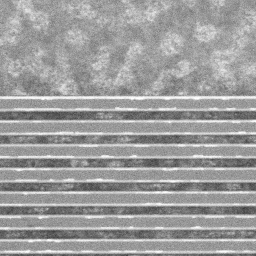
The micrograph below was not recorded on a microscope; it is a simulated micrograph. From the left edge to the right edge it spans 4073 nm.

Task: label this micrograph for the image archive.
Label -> parallel lines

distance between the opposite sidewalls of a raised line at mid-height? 215 nm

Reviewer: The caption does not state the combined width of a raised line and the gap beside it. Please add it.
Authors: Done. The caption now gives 23.7 pixels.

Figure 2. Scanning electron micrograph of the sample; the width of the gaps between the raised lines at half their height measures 157 nm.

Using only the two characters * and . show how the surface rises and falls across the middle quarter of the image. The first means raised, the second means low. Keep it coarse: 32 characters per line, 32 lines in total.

................................
................................
................................
................................
................................
................................
................................
................................
********************************
********************************
********************************
................................
................................
................................
********************************
********************************
********************************
********************************
................................
................................
********************************
********************************
********************************
................................
................................
................................
********************************
********************************
********************************
................................
................................
................................